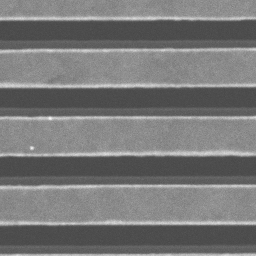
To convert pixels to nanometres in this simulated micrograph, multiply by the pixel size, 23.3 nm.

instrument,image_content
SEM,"lines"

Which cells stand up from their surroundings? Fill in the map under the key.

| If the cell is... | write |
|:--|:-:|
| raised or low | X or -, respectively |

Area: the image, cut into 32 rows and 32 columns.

XXXXXXXXXXXXXXXXXXXXXXXXXXXXXXXX
XXXXXXXXXXXXXXXXXXXXXXXXXXXXXXXX
--------------------------------
--------------------------------
--------------------------------
XXXXXXXXXXXXXXXXXXXXXXXXXXXXXXXX
XXXXXXXXXXXXXXXXXXXXXXXXXXXXXXXX
XXXXXXXXXXXXXXXXXXXXXXXXXXXXXXXX
XXXXXXXXXXXXXXXXXXXXXXXXXXXXXXXX
XXXXXXXXXXXXXXXXXXXXXXXXXXXXXXXX
XXXXXXXXXXXXXXXXXXXXXXXXXXXXXXXX
--------------------------------
--------------------------------
--------------------------------
XXXXXXXXXXXXXXXXXXXXXXXXXXXXXXXX
XXXXXXXXXXXXXXXXXXXXXXXXXXXXXXXX
XXXXXXXXXXXXXXXXXXXXXXXXXXXXXXXX
XXXXXXXXXXXXXXXXXXXXXXXXXXXXXXXX
XXXXXXXXXXXXXXXXXXXXXXXXXXXXXXXX
--------------------------------
--------------------------------
--------------------------------
XXXXXXXXXXXXXXXXXXXXXXXXXXXXXXXX
XXXXXXXXXXXXXXXXXXXXXXXXXXXXXXXX
XXXXXXXXXXXXXXXXXXXXXXXXXXXXXXXX
XXXXXXXXXXXXXXXXXXXXXXXXXXXXXXXX
XXXXXXXXXXXXXXXXXXXXXXXXXXXXXXXX
XXXXXXXXXXXXXXXXXXXXXXXXXXXXXXXX
--------------------------------
--------------------------------
--------------------------------
XXXXXXXXXXXXXXXXXXXXXXXXXXXXXXXX